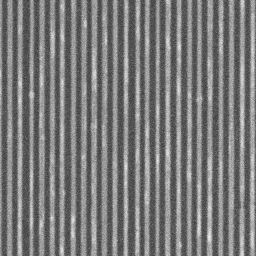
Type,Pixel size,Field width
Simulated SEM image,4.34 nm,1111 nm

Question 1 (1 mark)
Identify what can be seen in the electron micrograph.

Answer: parallel lines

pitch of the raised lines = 45.8 nm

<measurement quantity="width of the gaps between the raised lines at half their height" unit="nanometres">28.2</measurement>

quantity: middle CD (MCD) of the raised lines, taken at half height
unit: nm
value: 16.3